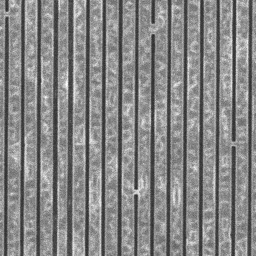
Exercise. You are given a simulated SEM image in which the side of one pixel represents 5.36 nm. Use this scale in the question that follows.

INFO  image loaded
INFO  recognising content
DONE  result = parallel lines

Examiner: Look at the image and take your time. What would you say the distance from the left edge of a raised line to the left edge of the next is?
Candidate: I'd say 0.087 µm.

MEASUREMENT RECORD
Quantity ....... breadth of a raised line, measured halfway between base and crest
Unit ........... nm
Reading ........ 63.6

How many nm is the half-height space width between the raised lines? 21.4